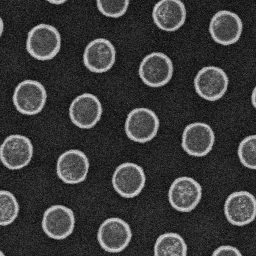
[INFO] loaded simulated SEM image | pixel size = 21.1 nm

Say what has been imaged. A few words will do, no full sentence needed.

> a regular array of raised bodies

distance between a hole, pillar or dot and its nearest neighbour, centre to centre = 1200 nanometres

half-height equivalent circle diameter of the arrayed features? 30.9 px